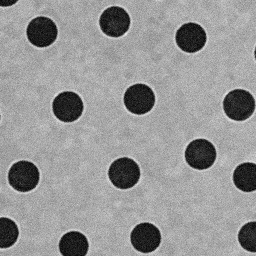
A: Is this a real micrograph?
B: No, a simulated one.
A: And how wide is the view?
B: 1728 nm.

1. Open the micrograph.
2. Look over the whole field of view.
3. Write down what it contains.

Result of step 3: a regular array of holes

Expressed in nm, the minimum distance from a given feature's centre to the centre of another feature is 494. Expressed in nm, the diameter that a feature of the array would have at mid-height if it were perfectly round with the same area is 217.